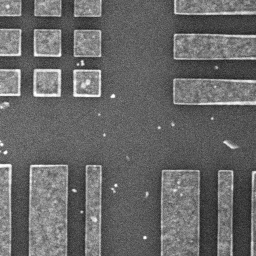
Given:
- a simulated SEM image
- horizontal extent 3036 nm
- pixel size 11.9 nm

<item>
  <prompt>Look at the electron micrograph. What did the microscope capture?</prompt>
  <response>groups of lines, slits or small figures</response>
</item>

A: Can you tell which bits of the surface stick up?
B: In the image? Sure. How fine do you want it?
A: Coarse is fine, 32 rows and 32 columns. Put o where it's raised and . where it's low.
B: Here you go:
ooo.oooo.oooo.........oooooooooo
ooo.oooo.oooo.........oooooooooo
................................
................................
ooo.oooo.ooo..........ooooooo...
oo..oooo.ooo..........oooooooooo
oo..oooo.ooo..........oooooooooo
................................
................................
oo..ooo..ooo....................
oo..ooo..ooo..........oooooooooo
oo..ooo..ooo..........oooooooooo
......................oooooooooo
................................
................................
................................
................................
................................
................................
................................
................................
o...oooo...oo.......ooooo...o...
o...oooo...oo.......ooooo..oo...
o...oooo...oo.......ooooo..oo...
o...oooo...oo.......ooooo..oo...
o...oooo...oo.......ooooo..oo...
o...oooo...oo.......ooooo..oo...
o...oooo...o........ooooo..oo...
o...oooo...o........ooooo..oo...
o...oooo...o........ooooo..oo...
o...oooo...o........ooooo..oo...
o...oooo...o........ooooo..oo...